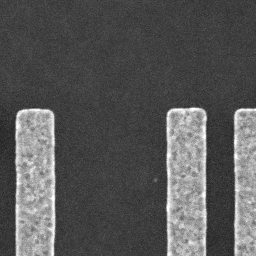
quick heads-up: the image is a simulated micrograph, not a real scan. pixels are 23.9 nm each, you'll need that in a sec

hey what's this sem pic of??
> wiring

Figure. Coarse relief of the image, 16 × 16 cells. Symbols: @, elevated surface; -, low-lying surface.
----------------
----------------
----------------
----------------
----------------
----------------
----------------
-@@--------@@--@
-@@--------@@--@
-@@--------@@--@
-@@--------@@--@
-@@--------@@--@
-@@--------@@--@
-@@--------@@--@
-@@--------@@--@
-@@--------@@--@